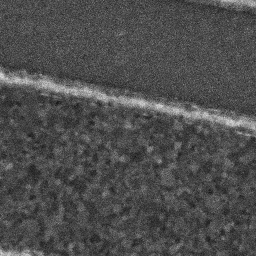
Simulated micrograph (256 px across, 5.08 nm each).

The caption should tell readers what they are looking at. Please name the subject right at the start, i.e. one or a few lines or trenches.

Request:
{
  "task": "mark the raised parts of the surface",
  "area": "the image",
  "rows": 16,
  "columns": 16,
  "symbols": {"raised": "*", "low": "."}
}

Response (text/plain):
................
................
................
................
................
****............
*********.......
**************..
****************
****************
****************
****************
****************
****************
****************
****************